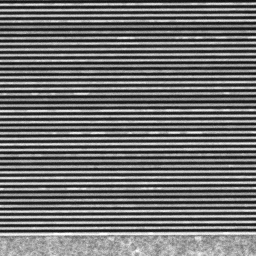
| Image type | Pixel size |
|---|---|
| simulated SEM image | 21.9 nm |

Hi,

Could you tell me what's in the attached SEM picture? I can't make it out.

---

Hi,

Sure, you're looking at parallel lines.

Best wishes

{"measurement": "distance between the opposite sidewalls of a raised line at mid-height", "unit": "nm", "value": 41.1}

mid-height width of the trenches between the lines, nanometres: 82.3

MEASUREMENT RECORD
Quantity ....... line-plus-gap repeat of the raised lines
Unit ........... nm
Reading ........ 123